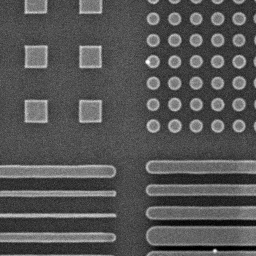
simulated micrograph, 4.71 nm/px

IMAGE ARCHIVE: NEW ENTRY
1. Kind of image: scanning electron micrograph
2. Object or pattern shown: groups of lines, slits or small figures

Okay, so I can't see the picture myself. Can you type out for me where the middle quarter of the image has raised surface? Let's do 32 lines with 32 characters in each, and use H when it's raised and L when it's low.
LLLLHHHHHLLLLLLLLLLLLHHLLLLHHLLL
LLLLLLLLLLLLLLLLLLLLLLLLLLLLLLLL
LLLLLLLLLLLLLLLLLLLLLLLLLLLLLLLL
LLLLLLLLLLLLLLLLLLLLLLHLLLLHLLLL
LLLLLLLLLLLLLLLLLLLLLHHHLLHHHLLL
LLLLLLLLLLLLLLLLLLLLLHHHLLHHHLLL
LLLLLLLLLLLLLLLLLLLLLLLLLLLLLLLL
LLLLLLLLLLLLLLLLLLLLLLLLLLLLLLLL
LLLLLLLLLLLLLLLLLLLLLLLLLLLLLLLL
LLLLHHHHHLLLLLLLLLLLLHHHLLHHHLLL
LLLLHHHHHLLLLLLLLLLLLHHHLLHHHLLL
LLLLHHHHHLLLLLLLLLLLLLLLLLLHLLLL
LLLLHHHHHLLLLLLLLLLLLLLLLLLLLLLL
LLLLHHHHHLLLLLLLLLLLLLLLLLLLLLLL
LLLLLLLLLLLLLLLLLLLLLHHHLLLHHLLL
LLLLLLLLLLLLLLLLLLLLLHHHLLHHHLLL
LLLLLLLLLLLLLLLLLLLLLHHHLLLHHLLL
LLLLLLLLLLLLLLLLLLLLLLLLLLLLLLLL
LLLLLLLLLLLLLLLLLLLLLLLLLLLLLLLL
LLLLLLLLLLLLLLLLLLLLLLLLLLLLLLLL
LLLLLLLLLLLLLLLLLLLLLLLLLLLLLLLL
LLLLLLLLLLLLLLLLLLLLLLLLLLLLLLLL
LLLLLLLLLLLLLLLLLLLLLLLLLLLLLLLL
LLLLLLLLLLLLLLLLLLLLLLLLLLLLLLLL
LLLLLLLLLLLLLLLLLLLLLHHHHHHHHHHH
LLLLLHHHHHHHLLLLLLLLLHHHHHHHHHHH
HHHHHHHHHHHHHLLLLLLLLHHHHHHHHHHH
HHHHHHHHHHHHHLLLLLLLLLLLLLLLLLLL
LLLLLLLLLLLLLLLLLLLLLLLLLLLLLLLL
LLLLLLLLLLLLLLLLLLLLLLLLLLLLLLLL
LLLLLLLLLLLLLLLLLLLLLHHHHHHHHHHH
LLLLLLLLLLLLLLLLLLLLLHHHHHHHHHHH